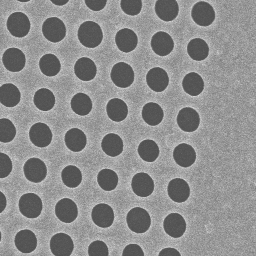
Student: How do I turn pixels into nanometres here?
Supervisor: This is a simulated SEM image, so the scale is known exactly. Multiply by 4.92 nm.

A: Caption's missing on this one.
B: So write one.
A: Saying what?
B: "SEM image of a regular array of holes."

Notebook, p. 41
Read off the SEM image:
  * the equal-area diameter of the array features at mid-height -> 0.116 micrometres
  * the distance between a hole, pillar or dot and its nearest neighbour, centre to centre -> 173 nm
